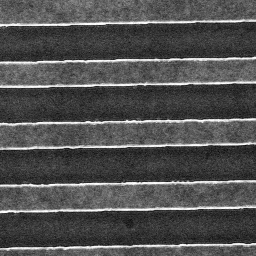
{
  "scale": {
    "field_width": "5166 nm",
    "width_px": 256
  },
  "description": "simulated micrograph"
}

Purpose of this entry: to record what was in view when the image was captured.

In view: lines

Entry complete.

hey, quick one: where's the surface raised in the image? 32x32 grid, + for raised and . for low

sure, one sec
++++++++++++++++++++++++++++++++
++++++++++++++++++++++++++++++++
++++++++++++++++++++++++++++++++
................................
................................
................................
................................
..............++++++++++++++++++
++++++++++++++++++++++++++++++++
++++++++++++++++++++++++++++++++
++++++++++++++++++++++++........
................................
................................
................................
................................
+.++++++++++++++++++++++++++++++
++++++++++++++++++++++++++++++++
++++++++++++++++++++++++++++++++
++++............................
................................
................................
................................
................................
++++++++++++++++++++++++++++++++
++++++++++++++++++++++++++++++++
++++++++++++++++++++++++++++++++
+...............................
................................
................................
................................
.............................+++
++++++++++++++++++++++++++++++++